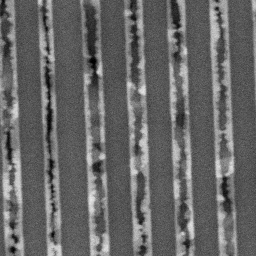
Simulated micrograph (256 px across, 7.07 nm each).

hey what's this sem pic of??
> parallel lines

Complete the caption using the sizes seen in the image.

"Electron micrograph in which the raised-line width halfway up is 0.117 µm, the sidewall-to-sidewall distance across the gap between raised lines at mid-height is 185 nanometres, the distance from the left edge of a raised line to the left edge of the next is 0.304 microns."